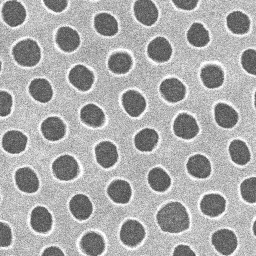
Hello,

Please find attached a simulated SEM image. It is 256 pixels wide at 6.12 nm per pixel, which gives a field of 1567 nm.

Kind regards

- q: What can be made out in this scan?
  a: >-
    a regular array of holes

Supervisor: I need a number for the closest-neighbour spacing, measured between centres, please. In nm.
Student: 247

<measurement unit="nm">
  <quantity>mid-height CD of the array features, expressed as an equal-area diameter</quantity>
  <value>154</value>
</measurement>